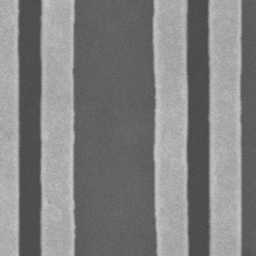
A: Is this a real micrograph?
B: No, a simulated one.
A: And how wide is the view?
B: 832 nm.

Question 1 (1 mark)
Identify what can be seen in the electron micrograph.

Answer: lines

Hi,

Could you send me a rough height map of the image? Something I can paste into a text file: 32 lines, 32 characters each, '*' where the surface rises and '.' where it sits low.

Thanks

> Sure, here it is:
**...****..........****...****..
**...****..........****...****..
**...****..........****...****..
**...****..........****...****..
**...****..........****...****..
**...****..........****...****..
**...****..........****...****..
**...****..........****...****..
**...****..........****...****..
**...****..........****...****..
**...****..........****...****..
**...****...........***...****..
**...****...........***...****..
**...****...........***...****..
**...****..........****...****..
**...****..........****...****..
**...****..........****...****..
**...****..........****...****..
**...****..........****...****..
**...****..........****...****..
**...****..........****...****..
**...****..........****...****..
**...****..........****...****..
**...****..........****...****..
**...****..........****...****..
**...****..........****...****..
**...****..........****...****..
**...****...........***...****..
**...****...........***...****..
**...****...........***...****..
**...****...........****..****..
**...****...........****..****..